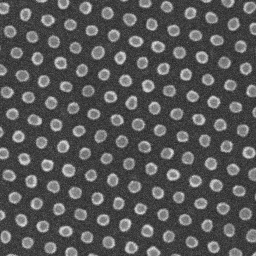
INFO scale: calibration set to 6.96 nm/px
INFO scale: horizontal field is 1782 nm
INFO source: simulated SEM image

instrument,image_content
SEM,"a regular array of raised bodies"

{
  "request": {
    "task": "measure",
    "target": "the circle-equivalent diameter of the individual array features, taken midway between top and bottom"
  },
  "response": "76.9 nm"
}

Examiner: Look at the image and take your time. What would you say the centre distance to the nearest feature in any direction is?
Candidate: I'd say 154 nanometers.